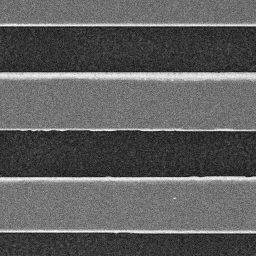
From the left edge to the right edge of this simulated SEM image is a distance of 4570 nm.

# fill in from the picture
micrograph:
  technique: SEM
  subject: lines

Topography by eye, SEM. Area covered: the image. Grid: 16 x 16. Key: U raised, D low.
UUUUUUUUUUUUUUUU
UUUUUUUUUUUUUUUU
DDDDDDDDDDDDDDDD
DDDDDDDDDDDDDDDD
DDDDDDDDDDDDDDDD
UUUUUUUUUUUUUUUU
UUUUUUUUUUUUUUUU
UUUUUUUUUUUUUUUU
DDDDDDDDDDDDDDDD
DDDDDDDDDDDDDDDD
DDDDDDDDDDDDDDDD
UUUUUUUUUUUUUUUU
UUUUUUUUUUUUUUUU
UUUUUUUUUUUUUUUU
DDDDDDDDUUUUUUUU
DDDDDDDDDDDDDDDD